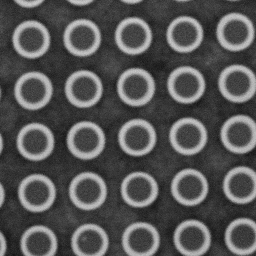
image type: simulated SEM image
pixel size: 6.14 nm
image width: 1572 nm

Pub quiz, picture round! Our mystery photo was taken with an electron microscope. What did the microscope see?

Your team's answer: an array of small figures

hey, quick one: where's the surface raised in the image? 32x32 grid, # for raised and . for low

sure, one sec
..###....##.....................
................................
..........#.....##....##....###.
..####..####...####..####..#####
..####..####..#####..####..#####
..####..####...####..####...###.
..####...###....##..............
................................
......................##....###.
...###...###...####..####...####
..####..#####..####..#####.#####
..####..#####..####..####...####
..####...###...####...###....##.
...##...........................
.............................##.
....#.....##....###...###...####
...###...####..####..#####..####
..#####.#####..####..#####..####
..#####..####..####...###...####
...###...###....................
................................
.......................##....###
...###...####...###...####..####
..#####..####..#####.#####..####
..#####..####..#####..####..####
...###...####...###....##.......
................................
..............................#.
....##....###...###...####..####
...####..####..#####..####..####
#..####..####..#####..####..####
#..####..####...###....###...###